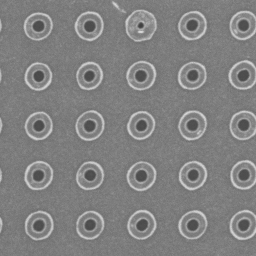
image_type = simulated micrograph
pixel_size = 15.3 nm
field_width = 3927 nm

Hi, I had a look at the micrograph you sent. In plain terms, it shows a regular array of ring-shaped raised bodies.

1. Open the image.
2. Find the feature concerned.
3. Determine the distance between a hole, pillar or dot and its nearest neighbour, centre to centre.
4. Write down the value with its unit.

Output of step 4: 758 nm